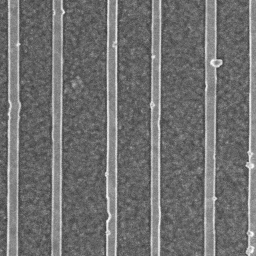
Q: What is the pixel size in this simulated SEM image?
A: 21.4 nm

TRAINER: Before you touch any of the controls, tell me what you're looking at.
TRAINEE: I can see parallel lines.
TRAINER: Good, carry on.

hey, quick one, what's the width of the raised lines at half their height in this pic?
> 0.201 micrometres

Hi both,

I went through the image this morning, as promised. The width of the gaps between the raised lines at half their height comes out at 758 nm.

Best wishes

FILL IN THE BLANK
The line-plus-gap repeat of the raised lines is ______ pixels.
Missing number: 49.2